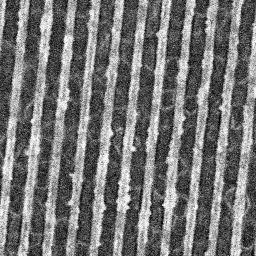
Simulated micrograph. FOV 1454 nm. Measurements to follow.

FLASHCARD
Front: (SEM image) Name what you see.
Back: parallel lines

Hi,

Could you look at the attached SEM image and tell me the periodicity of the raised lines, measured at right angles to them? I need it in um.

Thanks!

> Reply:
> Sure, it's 0.133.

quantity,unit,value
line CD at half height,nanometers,45.2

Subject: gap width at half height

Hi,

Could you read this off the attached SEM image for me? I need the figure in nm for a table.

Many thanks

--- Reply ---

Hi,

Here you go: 84.7